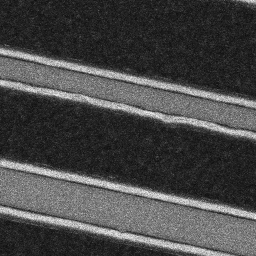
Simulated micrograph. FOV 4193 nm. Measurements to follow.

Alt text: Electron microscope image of one or a few lines or trenches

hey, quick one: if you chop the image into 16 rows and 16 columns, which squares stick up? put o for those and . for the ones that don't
oooooooooooooooo
oooooooooooooooo
oooooooooooooooo
..oooooooooooooo
......oooooooooo
oo.........ooooo
oooooo..........
ooooooooooo.....
oooooooooooooooo
oooooooooooooooo
..oooooooooooooo
......oooooooooo
...........ooooo
oo..............
ooooooo.........
ooooooooooo.....